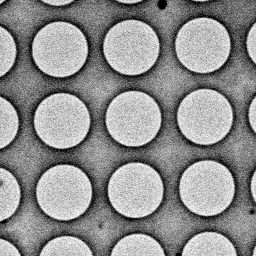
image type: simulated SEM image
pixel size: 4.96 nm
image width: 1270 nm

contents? an array of small figures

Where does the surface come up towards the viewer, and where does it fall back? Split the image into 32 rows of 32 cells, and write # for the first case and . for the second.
......##........................
................................
........................###.....
.....#####....#####....#####...#
#....#####...#######..#######..#
##..#######..#######..#######..#
##..#######..#######..#######..#
##..#######..######....#####....
#....#####....#####.....###.....
.......#........................
................................
................#.......###.....
#.....####....#####....#####....
##...######...######..#######..#
##..#######..#######..#######..#
##..#######..#######..#######..#
##...######...######...#####....
#....#####.....####.....###.....
................................
................................
................##......###.....
#.....####....#####....######...
##...######...######...######...
##...######...######...######..#
##...######...######...######...
##...######...######...######...
##....####.....####.....###.....
................................
................................
................##.......###....
#.....#####....#####...######...
##...######...######...######...